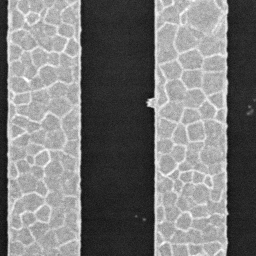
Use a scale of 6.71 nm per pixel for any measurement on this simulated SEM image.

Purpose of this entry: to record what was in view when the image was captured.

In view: one or a few lines or trenches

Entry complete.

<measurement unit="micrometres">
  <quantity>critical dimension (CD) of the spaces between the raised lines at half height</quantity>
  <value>0.51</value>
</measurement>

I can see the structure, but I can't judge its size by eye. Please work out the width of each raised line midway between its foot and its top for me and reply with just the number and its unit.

0.477 µm